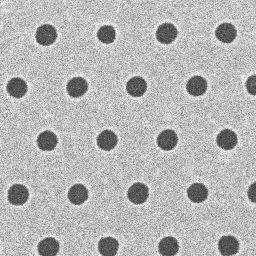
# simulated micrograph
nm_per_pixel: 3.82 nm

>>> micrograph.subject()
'a regular array of holes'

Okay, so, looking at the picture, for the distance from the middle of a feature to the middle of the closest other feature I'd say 228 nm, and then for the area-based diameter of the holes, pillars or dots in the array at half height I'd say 81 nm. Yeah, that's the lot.